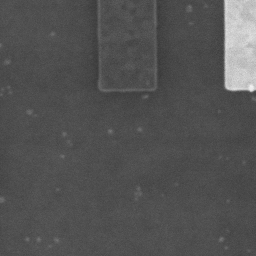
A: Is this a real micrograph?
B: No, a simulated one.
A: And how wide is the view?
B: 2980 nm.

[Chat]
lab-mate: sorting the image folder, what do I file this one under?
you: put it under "wiring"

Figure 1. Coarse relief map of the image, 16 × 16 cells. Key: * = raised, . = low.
......****....**
......****....**
......****....**
......****....**
......****....**
......***.....**
................
................
................
................
................
................
................
................
................
................